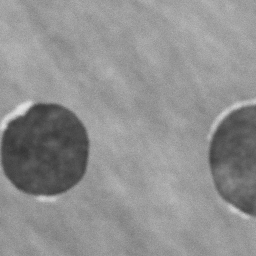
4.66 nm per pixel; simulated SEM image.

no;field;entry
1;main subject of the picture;holes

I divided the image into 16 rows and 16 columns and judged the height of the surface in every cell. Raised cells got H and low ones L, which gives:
HHHHHHHHHHHHHHHH
HHHHHHHHHHHHHHHH
HHHHHHHHHHHHHHHH
HHHHHHHHHHHHHHHH
HHHHHHHHHHHHHHHH
HHHHHHHHHHHHHHHH
HHLHHHHHHHHHHHHH
HLLLLHHHHHHHHHLL
LLLLLLHHHHHHHLLL
LLLLLLHHHHHHHLLL
LLLLLHHHHHHHHLLL
HLLLLHHHHHHHHLLL
HHHHHHHHHHHHHHLL
HHHHHHHHHHHHHHHH
HHHHHHHHHHHHHHHH
HHHHHHHHHHHHHHHH